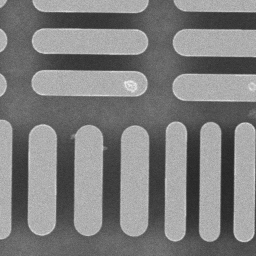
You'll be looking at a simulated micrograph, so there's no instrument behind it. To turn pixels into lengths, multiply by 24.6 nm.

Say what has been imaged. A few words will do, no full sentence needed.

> groups of lines, slits or small figures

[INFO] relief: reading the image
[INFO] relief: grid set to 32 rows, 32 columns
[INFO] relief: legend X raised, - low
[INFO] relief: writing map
X---XXXXXXXXXXXXXX----XXXXXXXXXX
--------------XXX---------------
--------------------------------
--------------------------------
X---XXXXXXXXXXXXXX----XXXXXXXXXX
X---XXXXXXXXXXXXXX----XXXXXXXXXX
-----XXXXXXXXXXXXX----XXXXXXXXXX
--------------------------------
--------------------------------
----XXXXXXXXXXXXXX----XXXXXXXXXX
X---XXXXXXXXXXXXXX----XXXXXXXXXX
X----XXXXXXXXXXXXX----XXXXXXXXXX
------------------------XXXXXXXX
--------------------------------
--------------------------------
X--------------------XX---X---X-
X---XXX---XXX---XX---XX--XXX-XXX
X---XXX--XXXX--XXXX--XX--XXX-XXX
X---XXX--XXXX--XXXX--XX--XXX-XXX
X---XXX--XXXX--XXXX--XX--XXX-XXX
X---XXX--XXXX--XXXX--XX--XXX-XXX
X---XXX--XXXX--XXXX--XX--XXX-XXX
X---XXX--XXXX--XXXX--XX--XXX-XXX
X---XXX--XXXX--XXXX--XX--XXX-XXX
X---XXX--XXXX--XXXX--XX--XXX-XXX
X---XXX--XXXX--XXX---XX--XXX-XXX
X---XXX--XXXX--XXX---XX--XXX-XXX
X---XXX--XXXX--XXX---XX--XXX-XXX
X---XXX--XXX---XXX---XX--XX--XXX
X--------------------XX--XX--XXX
--------------------------------
--------------------------------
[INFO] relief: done